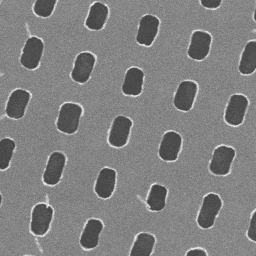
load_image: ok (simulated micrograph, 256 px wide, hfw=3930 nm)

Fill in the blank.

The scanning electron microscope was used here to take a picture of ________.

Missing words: a regular array of holes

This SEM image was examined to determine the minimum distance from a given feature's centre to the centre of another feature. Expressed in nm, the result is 802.